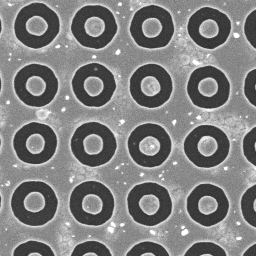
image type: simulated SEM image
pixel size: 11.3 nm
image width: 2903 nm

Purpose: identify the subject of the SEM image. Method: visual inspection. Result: a regular array of ring-shaped grooves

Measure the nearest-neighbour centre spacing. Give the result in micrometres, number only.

0.648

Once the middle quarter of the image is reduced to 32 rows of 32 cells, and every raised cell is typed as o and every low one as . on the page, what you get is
oooo......ooooooooo.....oooooooo
ooo........ooooooo.......ooooooo
ooo.........ooooo.........oooooo
oo....ooo....oooo...ooo....oooo.
oo...ooooo...ooo...ooooo...oooo.
oo...ooooo...ooo...ooooo...oooo.
oo...ooooo...ooo....oooo...oooo.
ooo...ooo...ooooo...ooo....oooo.
ooo.........ooooo.........oooooo
oooo.......ooooooo........oooooo
ooooo.....ooooooooo.....oooooooo
oooooooooooooooooooooooooooooooo
oooooooooooooooooooooooooooooooo
oooooooooooooooooooooooooooooooo
oooooo..oooooooooooooooooooooooo
oooo.......oooooooo.....oooooooo
ooo........oooooo........ooooooo
oo..........ooooo.........ooooo.
oo...oooo....ooo....ooo....oooo.
oo...ooooo...ooo...ooooo...ooo..
oo...ooooo...ooo...ooooo...ooo..
oo...oooo....ooo...ooooo...ooo..
oo....o......ooo....ooo....ooo..
ooo.........ooooo.........ooooo.
oooo.......ooooooo.......ooooooo
oooooo...oooooooooo....ooooooooo
oooooooooooooooooooooooooooooooo
oooooooooooooooooooooooooooooooo
oooooooooooooooooooooooooooooooo
ooooo....ooooooooooooooooooooooo
ooo.......oooooooo......oooooooo
oo.........oooooo.........oooooo